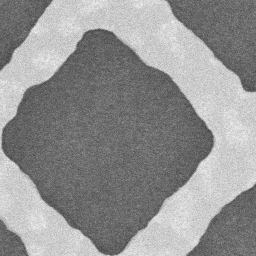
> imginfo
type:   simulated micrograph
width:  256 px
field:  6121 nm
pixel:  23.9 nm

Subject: holes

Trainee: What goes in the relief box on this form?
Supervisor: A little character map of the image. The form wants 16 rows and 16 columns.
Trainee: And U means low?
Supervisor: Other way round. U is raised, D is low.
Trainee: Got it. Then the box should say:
DDDUUUUUUUUDDDDD
DDUUUUUUUUUDDDDD
DDUUUDDDUUUUDDDD
DUUUDDDDDUUUUDDD
UUUDDDDDDDUUUUUD
UUDDDDDDDDDUUUUD
UDDDDDDDDDDDUUUU
UDDDDDDDDDDDDUUU
DDDDDDDDDDDDDUUU
DDDDDDDDDDDDDUUU
UDDDDDDDDDDDUUUU
UUDDDDDDDDDDUUUU
UUUDDDDDDDUUUUDD
UUUUDDDDDDUUUDDD
DUUUUDDDDUUUUDDD
DDUUUUDDUUUUDDDD